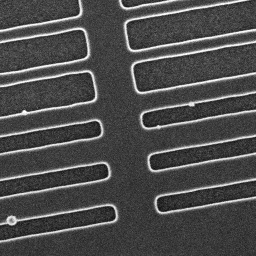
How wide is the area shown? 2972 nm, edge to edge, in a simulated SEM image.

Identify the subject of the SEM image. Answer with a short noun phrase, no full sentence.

groups of lines, slits or small figures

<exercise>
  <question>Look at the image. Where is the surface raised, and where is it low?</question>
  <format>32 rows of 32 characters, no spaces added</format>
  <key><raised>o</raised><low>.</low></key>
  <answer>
..........ooooo...oooooooooo....
..........oooooooooooo..........
.......ooooooooo................
.ooooooooooooooo................
ooooo......ooooo...........ooooo
...........ooooo.....ooooooooo..
...........oooooooooooooo.......
..........ooooooooo.............
....ooooooooooooo...............
ooooooo....oooooo.............oo
oo..........ooooo.......oooooooo
............oooooooooooooooooooo
............ooooooooooooooo.....
......ooooooooooooooo...........
.ooooooooooooooooo.........ooooo
ooooooooo...oooooo...ooooooooooo
ooo..........ooooooooooooooooooo
..........ooooooooooooooooooo...
....ooooooooooooooooooo.........
ooooooooooooooooooo...........oo
oooooooooooo.oooooo.....oooooooo
oooooo........oooooooooooooooooo
............oooooooooooooooooooo
.......ooooooooooooooooooo......
.ooooooooooooooooooo............
oooooooooooooooooooo......oooooo
ooooooooo.....oooooo.ooooooooooo
ooo...........oooooooooooooooooo
.........ooooooooooooooooooooooo
...ooooooooooooooooooooooooooooo
oooooooooooooooooooooooooooooooo
oooooooooooooooooooooooooooooooo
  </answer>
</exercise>